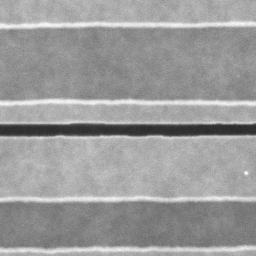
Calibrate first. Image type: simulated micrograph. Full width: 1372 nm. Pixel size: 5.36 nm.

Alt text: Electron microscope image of lines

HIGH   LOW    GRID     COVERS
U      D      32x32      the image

UUUUUUUUUUUUUUUUUUUUUUUUUUUUUUUU
UUUUUUUUUUUUUUUUUUUUUUUUUUUUUUUU
UUUUUUUUUUUUUUUUUUUUUUUUUUUUUUUU
DDDDDDDDDDDDDDDDDDDDDDDDDDDDDDDD
DDDDDDDDDDDDDDDDDDDDDDDDDDDDDDDD
DDDDDDDDDDDDDDDDDDDDDDDDDDDDDDDD
DDDDDDDDDDDDDDDDDDDDDDDDDDDDDDDD
DDDDDDDDDDDDDDDDDDDDDDDDDDDDDDDD
DDDDDDDDDDDDDDDDDDDDDDDDDDDDDDDD
DDDDDDDDDDDDDDDDDDDDDDDDDDDDDDDD
DDDDDDDDDDDDDDDDDDDDDDDDDDDDDDDD
DDDDDDDDDDDDDDDDDDDDDDDDDDDDDDDD
DDDDDDDDDDDDDDDDDDDDDDDDDDDDDDDD
UUUUUUUUUUUUUUUUUUUUUUUUUUUUUUUU
UUUUUUUUUUUUUUUUUUUUUUUUUUUUUUUU
DDDDDDDDDDDDDDDUDDDDDUUUDDDDDDDD
DDDDDDDDDDDDDDDDDDDDDDDDDDDDDDDD
UUUUUUUUUUUUUUUUUUUUUUUUUUUUUUUU
UUUUUUUUUUUUUUUUUUUUUUUUUUUUUUUU
UUUUUUUUUUUUUUUUUUUUUUUUUUUUUUUU
UUUUUUUUUUUUUUUUUUUUUUUUUUUUUUUU
UUUUUUUUUUUUUUUUUUUUUUUUUUUUUUUU
UUUUUUUUUUUUUUUUUUUUUUUUUUUUUUUU
UUUUUUUUUUUUUUUUUUUUUUUUUUUUUUUU
UUUUUUUUUUUUUUUUUUUUUUUUUUUUUUUU
DDDDDDDDDDDDDDDDDDDDDDDDDDDDDDDD
DDDDDDDDDDDDDDDDDDDDDDDDDDDDDDDD
DDDDDDDDDDDDDDDDDDDDDDDDDDDDDDDD
DDDDDDDDDDDDDDDDDDDDDDDDDDDDDDDD
DDDDDDDDDDDDDDDDDDDDDDDDDDDDDDDD
DDDDDDDDDDDDDDDDDDDDDDDDDDDDDDDD
UUUUUUUUUUUUUUUUUUUUUUUUUUUUUUUU